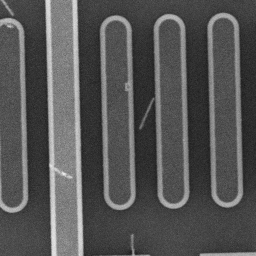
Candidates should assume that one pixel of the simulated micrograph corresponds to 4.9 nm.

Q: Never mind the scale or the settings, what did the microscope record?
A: groups of lines, slits or small figures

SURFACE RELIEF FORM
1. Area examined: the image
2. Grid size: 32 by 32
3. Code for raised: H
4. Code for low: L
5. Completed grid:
LLLLLLHHHLLLLLLLLLLLLLLLLLLLLLLL
LLLLLLHHHLLLLLLLLLLLLLLLLLLLLLLL
LLLLLLHHHLLLLLHLLLLLHHLLLLLHHLLL
HHHLLLHHHLLLLHHHLLLLHHHLLLHHHHLL
HHHLLLHHHLLLLHHHLLLLHHHLLLHHHHLL
HHHLLLHHHLLLLHHHLLLLHHHLLLHHHHLL
HHHLLLHHHLLLLHHHLLLLHHHLLLHHHHLL
HHHLLLHHHLLLLHHHLLLLHHHLLLHHHHLL
HHHLLLHHHLLLLHHHLLLLHHHLLLHHHHLL
HHHLLLHHHHLLLHHHLLLLHHHLLLHHHHLL
HHHLLLHHHHLLLHHHLLLLHHHLLLHHHHLL
HHHLLLHHHHLLLHHHLLLLHHHLLLHHHHLL
HHHLLLHHHHLLLHHHLLLLHHHLLLHHHHLL
HHHLLLHHHHLLLHHHLLLLHHHLLLHHHHLL
HHHLLLHHHHLLLHHHLLLLHHHLLLHHHHLL
HHHLLLHHHHLLLHHHLLLLHHHLLLLHHHLL
HHHLLLHHHHLLLHHHLLLLHHHLLLLHHHLL
HHHLLLHHHHLLLHHHLLLLHHHLLLLHHHLL
HHHLLLHHHHLLLHHHLLLLHHHLLLLHHHLL
HHHLLLHHHHLLLHHHLLLLHHHLLLLHHHLL
HHHLLLHHHHLLLHHHHLLLHHHLLLLHHHLL
HHHLLLHHHHLLLHHHHLLLHHHLLLLHHHLL
HHHLLLLHHHLLLHHHHLLLHHHLLLLHHHLL
HHHLLLLHHHLLLHHHHLLLHHHLLLLHHHLL
HHHLLLLHHHLLLHHHHLLLHHHLLLLHHHLL
HHHLLLLHHHLLLLHHLLLLLHHLLLLLHLLL
LLLLLLLHHHLLLLLLLLLLLLLLLLLLLLLL
LLLLLLLHHHLLLLLLLLLLLLLLLLLLLLLL
LLLLLLLHHHLLLLLLLLLLLLLLLLLLLLLL
LLLLLLLHHHLLLLLLLLLLLLLLLLLLLLLL
LLLLLLLHHHLLLLLLLLLLLLLLLLLLLLLL
LLLLLLLHHHLLLLLLLLLLLLLLLLLLLLLL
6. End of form